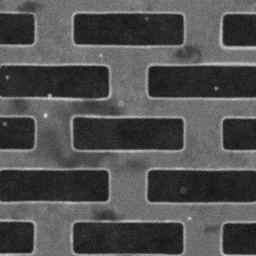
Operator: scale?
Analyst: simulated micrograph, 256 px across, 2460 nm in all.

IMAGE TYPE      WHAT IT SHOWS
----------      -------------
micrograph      groups of lines, slits or small figures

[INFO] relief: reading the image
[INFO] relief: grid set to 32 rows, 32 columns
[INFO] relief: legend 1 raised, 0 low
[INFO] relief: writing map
11111111111111111111111111111111
11111111111111111111111111111111
00001111100000000000000111110000
00001111100000000000000111110000
00001111100000000000000111110000
00001111110000000000000111110000
11111111111111111111111111111111
11111111111111111111111111111111
00000000000001111110000000000000
00000000000000111100000000000000
00000000000000111100000000000000
00000000000000111110000000000000
11111111111111111111111111111111
11111111111111111111111111111111
11111111111111111111111111111111
00001111100000000000000111110000
00001111100000000000000111110000
00001111100000000000000111110000
00001111100000000000000111110000
11111111111111111111111111111111
11111111111111111111111111111111
00000000000001111110000000000000
00000000000000111100000000000000
00000000000000111100000000000000
00000000000000111100000000000000
11111111111111111111111111111111
11111111111111111111111111111111
11111111111111111111111111111111
00001111100000000000000111110000
00001111100000000000000111110000
00001111100000000000000111110000
00001111100000000000000111110000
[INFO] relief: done